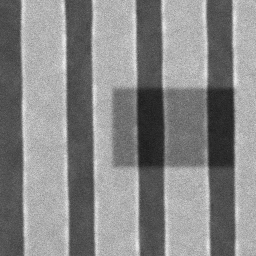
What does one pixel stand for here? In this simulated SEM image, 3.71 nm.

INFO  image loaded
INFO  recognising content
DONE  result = wiring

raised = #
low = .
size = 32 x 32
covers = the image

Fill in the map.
...#####....#####...######...###
...#####....#####...######...###
...#####....#####...######...###
...#####....#####...######...###
...#####....#####...######...###
...#####....#####...######...###
...#####....#####...######...###
...#####....#####...######...###
...#####....#####...######...###
...#####....#####....#####...###
...#####....#####...######...###
...#####....#####...######...###
...#####....#####...######...###
...#####....#####....#####...###
...#####....#####....#####...###
...#####....#####....#####...###
...#####....#####....#####...###
...#####....#####....#####...###
...#####....#####....#####....##
...#####....#####....#####...###
...#####....#####....#####...###
...#####....#####....#####...###
...#####....#####....#####...###
...#####....#####....#####...###
...#####....#####....#####...###
...#####....#####....#####....##
...#####....#####....#####....##
...######...#####....#####....##
...######...#####....#####....##
...######...#####....#####....##
...#####....#####....#####....##
...#####....#####....##.##....##